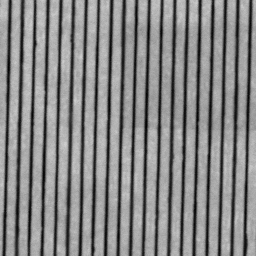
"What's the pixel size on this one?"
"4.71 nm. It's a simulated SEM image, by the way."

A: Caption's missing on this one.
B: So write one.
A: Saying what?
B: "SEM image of parallel lines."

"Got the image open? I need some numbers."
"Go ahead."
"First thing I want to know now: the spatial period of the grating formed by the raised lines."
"59.8 nm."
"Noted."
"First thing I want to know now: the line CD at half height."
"48.3 nm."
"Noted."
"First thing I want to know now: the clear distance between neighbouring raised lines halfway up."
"12.4 nm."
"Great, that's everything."